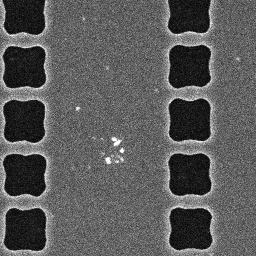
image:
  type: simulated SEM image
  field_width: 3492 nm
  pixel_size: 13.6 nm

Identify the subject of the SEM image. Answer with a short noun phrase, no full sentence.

a regular array of holes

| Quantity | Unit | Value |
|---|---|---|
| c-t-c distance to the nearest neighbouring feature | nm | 736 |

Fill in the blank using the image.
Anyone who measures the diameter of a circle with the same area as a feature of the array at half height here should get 627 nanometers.